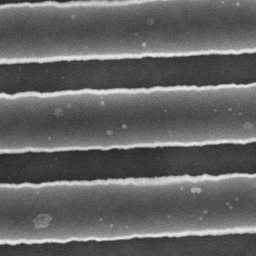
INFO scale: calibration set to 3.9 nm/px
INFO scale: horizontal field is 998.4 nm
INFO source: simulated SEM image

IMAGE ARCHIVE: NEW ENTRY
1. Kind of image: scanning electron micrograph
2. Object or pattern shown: lines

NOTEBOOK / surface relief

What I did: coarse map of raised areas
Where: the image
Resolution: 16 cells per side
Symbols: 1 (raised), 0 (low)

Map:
1111111111111111
1111111111111111
1111111111111111
1111111110000000
0000000000000000
0000000001111111
1111111111111111
1111111111111111
1111111111111111
1000000000000000
0000000000000000
0111111111111111
1111111111111111
1111111111111111
1111111111111110
0000000000000000